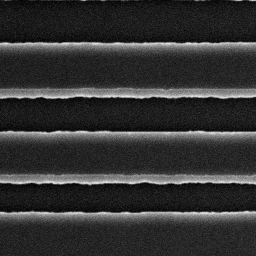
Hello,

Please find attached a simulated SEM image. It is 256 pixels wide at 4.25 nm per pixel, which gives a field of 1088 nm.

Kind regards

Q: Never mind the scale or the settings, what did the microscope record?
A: lines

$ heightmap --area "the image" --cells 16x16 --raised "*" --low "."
................
................
................
****************
****************
****************
................
................
****************
****************
****************
................
................
****************
****************
****************